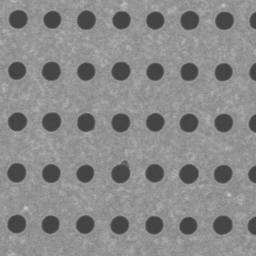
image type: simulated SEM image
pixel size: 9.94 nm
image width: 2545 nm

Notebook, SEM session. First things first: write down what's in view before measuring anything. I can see a regular array of holes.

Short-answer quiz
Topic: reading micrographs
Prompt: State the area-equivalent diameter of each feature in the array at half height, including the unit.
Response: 182 nm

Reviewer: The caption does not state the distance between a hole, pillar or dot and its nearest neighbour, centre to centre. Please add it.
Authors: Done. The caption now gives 339 nm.